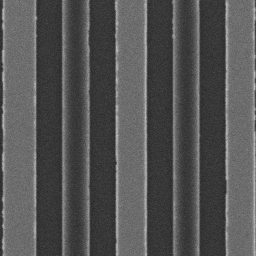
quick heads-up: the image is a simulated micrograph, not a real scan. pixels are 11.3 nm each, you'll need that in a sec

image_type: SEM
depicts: lines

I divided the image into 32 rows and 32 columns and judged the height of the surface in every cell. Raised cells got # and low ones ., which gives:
####....###....###....###...####
####....###....###....###...####
####....###....###....###...####
####....###....###....###...####
####....###....###....###...####
####....###....###....###...####
####....###....###....###...####
####....###....###....###...####
####....###....###....###...####
####....###....###....###...####
####....###....###....###...####
####....###....###....###...####
####....###....###....###...####
####....###....###....###...####
####....###....###....###...####
####....###....###....###...####
####....###....###....###...####
####....###....###....###...####
####....###....###....###...####
####....###....###....###...####
####....###....###....###...####
####....###....###....###...####
####....###....###....###...####
####....###....###....###...####
####....###....###....###...####
####....###....###....###...####
####....###....###....###...####
####....###....###....###...####
####....###....###....###...####
####....###....###....###...####
####....###....###....###...####
####....###....###....###...####